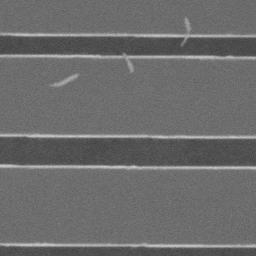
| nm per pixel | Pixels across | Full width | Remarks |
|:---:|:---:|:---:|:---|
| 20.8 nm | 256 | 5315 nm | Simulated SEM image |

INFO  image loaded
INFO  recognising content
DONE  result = lines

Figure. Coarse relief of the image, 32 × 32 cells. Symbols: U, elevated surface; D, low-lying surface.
UUUUUUUUUUUUUUUUUUUUUUUUUUUUUUUU
UUUUUUUUUUUUUUUUUUUUUUUUUUUUUUUU
UUUUUUUUUUUUUUUUUUUUUUUUUUUUUUUU
UUUUUUUUUUUUUUUUUUUUUUUUUUUUUUUU
DDDDDDDDDDDDDDDDDDUUUUUUUUUUUUUU
DDDDDDDDDDDDDDDDDDDDDDDDDDDDDDDD
DDDDDDDDDDDDDDDDDDDDDDDDDDDDDDDD
UUUUUUUUUUUUUUUUUUUUUUUUUUUUUUUU
UUUUUUUUUUUUUUUUUUUUUUUUUUUUUUUU
UUUUUUUUUUUUUUUUUUUUUUUUUUUUUUUU
UUUUUUUUUUUUUUUUUUUUUUUUUUUUUUUU
UUUUUUUUUUUUUUUUUUUUUUUUUUUUUUUU
UUUUUUUUUUUUUUUUUUUUUUUUUUUUUUUU
UUUUUUUUUUUUUUUUUUUUUUUUUUUUUUUU
UUUUUUUUUUUUUUUUUUUUUUUUUUUUUUUU
UUUUUUUUUUUUUUUUUUUUUUUUUUUUUUUU
UUUUUUUUUUUUUUUUUUUUUUUUUUUUUUUU
DDDDDDDDDDDDDDDDDDDDDDDDDDDDDDDD
DDDDDDDDDDDDDDDDDDDDDDDDDDDDDDDD
DDDDDDDDDDDDDDDDDDDDDDDDDDDDDDDD
DDDDDDDDDDDDDDDDDDDDDDDDDDDDDDDD
UUUUUUUUUUUUUUUUUUUUUUUUUUUUUUUU
UUUUUUUUUUUUUUUUUUUUUUUUUUUUUUUU
UUUUUUUUUUUUUUUUUUUUUUUUUUUUUUUU
UUUUUUUUUUUUUUUUUUUUUUUUUUUUUUUU
UUUUUUUUUUUUUUUUUUUUUUUUUUUUUUUU
UUUUUUUUUUUUUUUUUUUUUUUUUUUUUUUU
UUUUUUUUUUUUUUUUUUUUUUUUUUUUUUUU
UUUUUUUUUUUUUUUUUUUUUUUUUUUUUUUU
UUUUUUUUUUUUUUUUUUUUUUUUUUUUUUUU
UUUUUUUUUUUUUUUUUUUUUUUUUUUUUUUU
DDDDDDDDDDDDDDDDDDDDDDDDDDDDDDDD